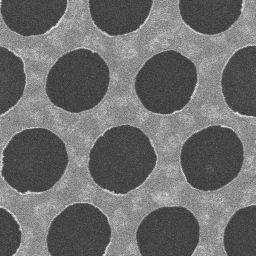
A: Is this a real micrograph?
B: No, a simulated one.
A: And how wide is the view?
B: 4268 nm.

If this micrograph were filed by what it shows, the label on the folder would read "holes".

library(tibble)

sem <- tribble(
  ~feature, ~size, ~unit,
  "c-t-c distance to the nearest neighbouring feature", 88.2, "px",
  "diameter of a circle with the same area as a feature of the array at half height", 1070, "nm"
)